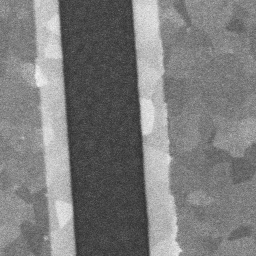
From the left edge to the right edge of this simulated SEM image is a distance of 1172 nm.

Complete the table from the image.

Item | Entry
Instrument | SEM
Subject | one or a few lines or trenches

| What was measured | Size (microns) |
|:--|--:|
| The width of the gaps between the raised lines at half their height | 0.466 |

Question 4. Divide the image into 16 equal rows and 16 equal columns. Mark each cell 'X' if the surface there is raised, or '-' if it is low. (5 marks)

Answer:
XXX------XXXXXXX
XXX------XXXXXXX
XXX------XXXXXXX
XXX------XXXXXXX
XXX------XXXXXXX
XXX-------XXXXXX
XXX-------XXXXXX
XXX-------XXXXXX
XXX-------XXXXXX
XXX-------XXXXXX
XXX-------XXXXXX
XXXX------XXXXXX
XXXX------XXXXXX
XXXX------XXXXXX
XXXX------XXXXXX
XXXX------XXXXXX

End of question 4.